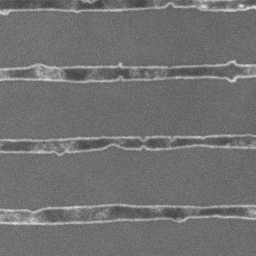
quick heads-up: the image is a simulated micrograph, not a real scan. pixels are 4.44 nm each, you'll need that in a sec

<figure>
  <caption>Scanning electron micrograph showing one or a few lines or trenches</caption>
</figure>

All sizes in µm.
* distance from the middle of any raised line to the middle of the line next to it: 0.312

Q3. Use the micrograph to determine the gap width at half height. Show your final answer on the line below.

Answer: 254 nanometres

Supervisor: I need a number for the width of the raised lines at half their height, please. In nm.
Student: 57.7